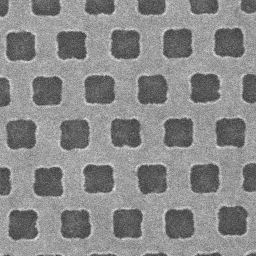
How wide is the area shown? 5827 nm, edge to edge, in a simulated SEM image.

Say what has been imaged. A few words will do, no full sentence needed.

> a regular array of holes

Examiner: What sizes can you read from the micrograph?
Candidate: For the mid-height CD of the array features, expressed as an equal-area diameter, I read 738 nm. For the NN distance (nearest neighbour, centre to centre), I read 1160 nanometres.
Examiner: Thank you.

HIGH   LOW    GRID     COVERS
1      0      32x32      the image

01110000111000111000011100011100
01110001111000111000111100011110
11111111111111111111111111111111
11111111111111111111110111111011
10001110000111000111000011100011
10001110000111000111000011100011
10001110000111000111000011100001
10001111111111111111111111111111
11111111111111111111111111111111
11111111111000111100111100011110
01110000111000111000011100001100
01110000111000111000011100011100
01110000111000111000011100011100
11111111111111111111111111111111
11111111111111111111111111111111
10001111000111000011000011100001
10001111000111000011100011100001
10001111000111000011000011100001
10001111000111111111111111111111
11111111111111111111111111111111
11111111111111111111111110011110
01110000110000111000011100011100
01110000111000111000011100011100
01110000111000111000011100011100
11111001111111111111111111111111
11111111111111111111111111111111
10001111000111000011100011100001
10000111000111000011100011100001
10000111000111000011100011100001
10000111000111000011100011110011
11111111111111111111111111111111
11111111111111111111111111111111